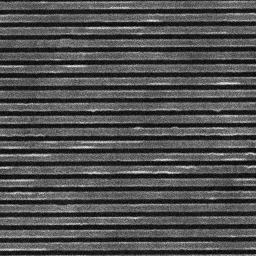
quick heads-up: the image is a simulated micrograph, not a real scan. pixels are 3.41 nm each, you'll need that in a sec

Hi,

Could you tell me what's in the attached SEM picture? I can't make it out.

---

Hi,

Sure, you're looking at parallel lines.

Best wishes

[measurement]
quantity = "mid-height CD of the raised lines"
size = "26.5 nanometres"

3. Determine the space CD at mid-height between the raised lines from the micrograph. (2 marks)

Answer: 17.5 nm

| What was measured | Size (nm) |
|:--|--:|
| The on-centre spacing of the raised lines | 43.3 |